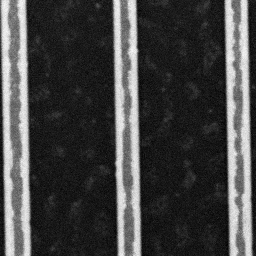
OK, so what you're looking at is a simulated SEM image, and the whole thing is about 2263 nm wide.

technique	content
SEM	one or a few lines or trenches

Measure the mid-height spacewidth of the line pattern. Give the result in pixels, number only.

94.8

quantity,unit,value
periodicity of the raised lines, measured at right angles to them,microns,0.984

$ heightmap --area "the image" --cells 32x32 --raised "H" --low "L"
LHHLLLLLLLLLLLLHHLLLLLLLLLLLLHHL
LHHLLLLLLLLLLLLHHLLLLLLLLLLLLHHL
LHHLLLLLLLLLLLLHHLLLLLLLLLLLLHHL
LHHLLLLLLLLLLLLHHLLLLLLLLLLLLHHL
LHHLLLLLLLLLLLLHHLLLLLLLLLLLLHHL
LHHLLLLLLLLLLLLHHLLLLLLLLLLLLHHL
LHHLLLLLLLLLLLLHHLLLLLLLLLLLLHHL
LHHLLLLLLLLLLLLHHLLLLLLLLLLLLHHL
LHHLLLLLLLLLLLLHHLLLLLLLLLLLLHHL
LHHLLLLLLLLLLLLHHLLLLLLLLLLLLHHL
LHHLLLLLLLLLLLLHHLLLLLLLLLLLLHHL
LHHLLLLLLLLLLLLHHLLLLLLLLLLLLHHL
LHHLLLLLLLLLLLLHHLLLLLLLLLLLLHHL
LHHLLLLLLLLLLLLHHLLLLLLLLLLLLHHL
LHHLLLLLLLLLLLLHHLLLLLLLLLLLLHHL
LHHLLLLLLLLLLLLHHLLLLLLLLLLLLHHL
LHHLLLLLLLLLLLLHHLLLLLLLLLLLLHHL
LHHLLLLLLLLLLLLHHLLLLLLLLLLLLHHL
LHHLLLLLLLLLLLLHHLLLLLLLLLLLLHHL
LHHLLLLLLLLLLLLHHLLLLLLLLLLLLHHL
LHHLLLLLLLLLLLLHHLLLLLLLLLLLLHHL
LHHLLLLLLLLLLLLHHLLLLLLLLLLLLHHL
LHHLLLLLLLLLLLLHHLLLLLLLLLLLLHHL
LHHLLLLLLLLLLLLHHLLLLLLLLLLLLHHL
LHHLLLLLLLLLLLLHHLLLLLLLLLLLLHHL
LHHLLLLLLLLLLLLHHLLLLLLLLLLLLHHL
LHHLLLLLLLLLLLLHHLLLLLLLLLLLLHHL
LHHLLLLLLLLLLLLHHLLLLLLLLLLLLHHL
LHHLLLLLLLLLLLLHHLLLLLLLLLLLLHHL
LHHLLLLLLLLLLLLHHLLLLLLLLLLLLHHL
LHHLLLLLLLLLLLLHHLLLLLLLLLLLLHHL
LHHLLLLLLLLLLLLHHLLLLLLLLLLLLHHL